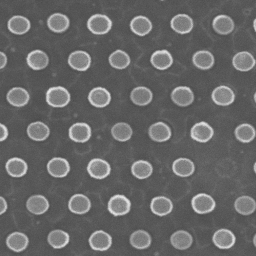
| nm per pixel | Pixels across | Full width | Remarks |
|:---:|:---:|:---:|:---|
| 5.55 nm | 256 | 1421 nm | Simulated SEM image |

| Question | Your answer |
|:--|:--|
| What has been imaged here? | a regular array of raised bodies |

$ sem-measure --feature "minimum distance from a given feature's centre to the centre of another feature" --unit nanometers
222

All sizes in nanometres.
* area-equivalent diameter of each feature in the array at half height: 114